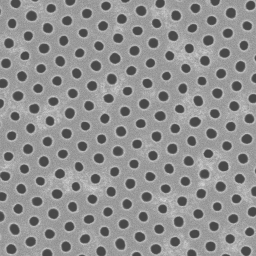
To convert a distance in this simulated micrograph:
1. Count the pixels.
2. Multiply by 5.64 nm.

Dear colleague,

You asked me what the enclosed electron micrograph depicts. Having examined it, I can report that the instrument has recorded a regular array of holes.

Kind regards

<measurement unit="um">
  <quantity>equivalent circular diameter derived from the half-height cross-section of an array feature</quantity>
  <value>0.0517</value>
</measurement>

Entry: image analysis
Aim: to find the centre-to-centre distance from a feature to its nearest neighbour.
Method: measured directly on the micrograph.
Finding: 113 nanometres